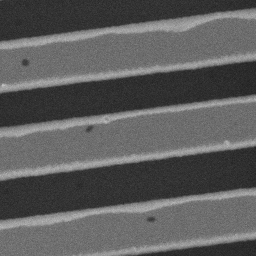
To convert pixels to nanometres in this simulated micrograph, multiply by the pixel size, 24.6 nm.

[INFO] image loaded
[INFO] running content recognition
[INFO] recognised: lines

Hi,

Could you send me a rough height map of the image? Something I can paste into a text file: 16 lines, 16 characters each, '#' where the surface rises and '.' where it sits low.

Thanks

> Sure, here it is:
................
.........#######
..##############
################
##########......
##..............
............####
....############
################
#############...
#####...........
................
...........#####
...#############
################
############....